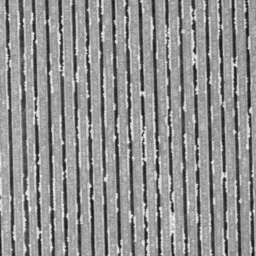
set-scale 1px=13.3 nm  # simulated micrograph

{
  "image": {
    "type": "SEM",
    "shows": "parallel lines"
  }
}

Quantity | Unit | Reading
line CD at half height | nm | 123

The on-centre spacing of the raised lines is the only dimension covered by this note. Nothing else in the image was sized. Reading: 0.178 microns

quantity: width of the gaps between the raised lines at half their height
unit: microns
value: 0.0483